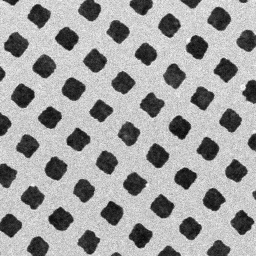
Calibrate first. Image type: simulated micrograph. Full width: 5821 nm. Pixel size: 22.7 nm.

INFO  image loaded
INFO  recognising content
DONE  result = a regular array of holes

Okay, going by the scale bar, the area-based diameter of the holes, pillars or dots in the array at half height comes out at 498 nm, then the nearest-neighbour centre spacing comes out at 810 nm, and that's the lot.